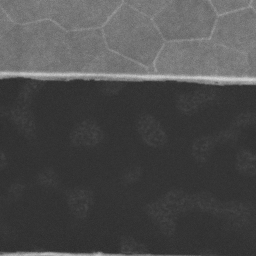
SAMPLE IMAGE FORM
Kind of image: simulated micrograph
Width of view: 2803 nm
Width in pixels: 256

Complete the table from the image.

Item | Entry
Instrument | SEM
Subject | one or a few lines or trenches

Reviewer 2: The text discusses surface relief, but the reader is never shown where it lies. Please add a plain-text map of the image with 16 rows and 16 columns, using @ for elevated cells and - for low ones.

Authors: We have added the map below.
@@@@@@@@@@@@@@@@
@@@@@@@@@@@@@@@@
@@@@@@@@@@@@@@@@
@@@@@@@@@@@@@@@@
@@@@@@@@@@@@@@@@
----------------
----------------
----------------
----------------
----------------
----------------
----------------
----------------
----------------
----------------
----------------